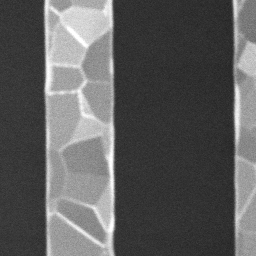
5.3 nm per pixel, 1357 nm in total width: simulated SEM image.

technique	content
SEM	wiring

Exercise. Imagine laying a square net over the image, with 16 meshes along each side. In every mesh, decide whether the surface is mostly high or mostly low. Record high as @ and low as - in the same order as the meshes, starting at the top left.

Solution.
---@@@@--------@
---@@@@--------@
---@@@@--------@
---@@@@--------@
---@@@@--------@
---@@@@--------@
---@@@@--------@
---@@@@--------@
---@@@@--------@
---@@@@--------@
---@@@@--------@
---@@@@--------@
---@@@@--------@
---@@@@--------@
---@@@@--------@
---@@@@--------@